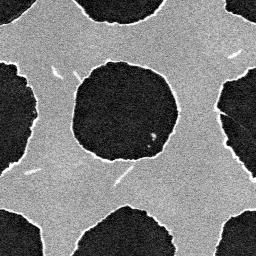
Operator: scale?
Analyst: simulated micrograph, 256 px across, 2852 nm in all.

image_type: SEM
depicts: holes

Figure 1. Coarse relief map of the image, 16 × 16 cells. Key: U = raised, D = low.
DDUUUDDDDDUUUUDD
UUUUUUUDUUUUUUUU
UUUUUUUUUUUUUUUU
UUUUUUUUUUUUUUUU
DUUUUUDDDDUUUUUD
DDUUUDDDDDDUUUDD
DDUUUDDDDDDUUUDD
DDUUUDDDDDDUUUDD
DDUUUDDDDDDUUUDD
DDUUUUDDDDUUUUUD
DUUUUUUUUUUUUUUD
UUUUUUUUUUUUUUUU
UUUUUUUUUUUUUUUU
DUUUUUUDDUUUUUUD
DDDUUDDDDDDUUUDD
DDDUUDDDDDDUUUDD